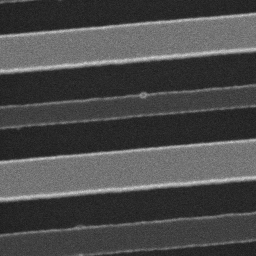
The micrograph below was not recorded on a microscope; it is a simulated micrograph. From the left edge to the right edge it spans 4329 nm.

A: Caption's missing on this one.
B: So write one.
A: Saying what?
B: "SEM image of lines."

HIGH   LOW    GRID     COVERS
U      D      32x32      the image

DDDDDDDDDDDDDDDDDDDDDDDDDDDDDDDD
DDDDDDDDDDDDDDDDDDDDDDDDDDDDDDDD
DDDDDDDDDDDDDDDDDDDDDDUUUUUUUUUU
DDDDDDDDDDDUUUUUUUUUUUUUUUUUUUUU
UUUUUUUUUUUUUUUUUUUUUUUUUUUUUUUU
UUUUUUUUUUUUUUUUUUUUUUUUUUUUUUUU
UUUUUUUUUUUUUUUUUUUUUUUUUUUUUUDD
UUUUUUUUUUUUUUUUUUUDDDDDDDDDDDDD
UUUUUUUUDDDDDDDDDDDDDDDDDDDDDDDD
DDDDDDDDDDDDDDDDDDDDDDDDDDDDDDDD
DDDDDDDDDDDDDDDDDDDDDDDDDDDDDDDD
DDDDDDDDDDDDDDDDDDDDDUUUUUUUUUUU
DDDDDDDDDDUUUUUUUUUUUUUUUUUUUUUU
UUUUUUUUUUUUUUUUUUUUUUUUUUUUUUDD
UUUUUUUUUUUUUUUUUUDDDDDDDDDDDDDD
UUUUUUUDDDDDDDDDDDDDDDDDDDDDDDDD
DDDDDDDDDDDDDDDDDDDDDDDDDDDDDDDD
DDDDDDDDDDDDDDDDDDDDDDDDDDDDDDUU
DDDDDDDDDDDDDDDDDDUUUUUUUUUUUUUU
DDDDDDDUUUUUUUUUUUUUUUUUUUUUUUUU
UUUUUUUUUUUUUUUUUUUUUUUUUUUUUUUU
UUUUUUUUUUUUUUUUUUUUUUUUUUUUUUUU
UUUUUUUUUUUUUUUUUUUUUUUUUUUUUUUD
UUUUUUUUUUUUUUUUUUUDDDDDDDDDDDDD
UUUUUUUUDDDDDDDDDDDDDDDDDDDDDDDD
DDDDDDDDDDDDDDDDDDDDDDDDDDDDDDDD
DDDDDDDDDDDDDDDDDDDDDDDDDDDDDDDD
DDDDDDDDDDDDDDDDDDDDDUUUUUUUUUUU
DDDDDDDDDDUUUUUUUUUUUUUUUUUUUUUU
UUUUUUUUUUUUUUUUUUUUUUUUUUUUUUUU
UUUUUUUUUUUUUUUUUUUUUUUUUUUUDDDD
UUUUUUUUUUUUUUUDDDDDDDDDDDDDDDDD